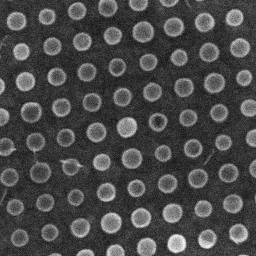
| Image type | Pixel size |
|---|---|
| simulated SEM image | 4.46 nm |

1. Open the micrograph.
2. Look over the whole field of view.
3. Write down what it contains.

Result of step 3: a regular array of raised bodies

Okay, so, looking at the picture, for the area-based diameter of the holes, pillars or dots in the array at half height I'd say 78.5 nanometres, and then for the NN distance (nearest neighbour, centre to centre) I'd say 0.135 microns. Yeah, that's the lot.